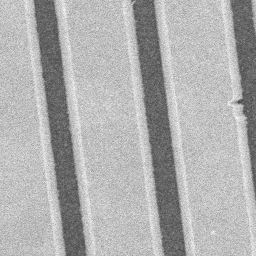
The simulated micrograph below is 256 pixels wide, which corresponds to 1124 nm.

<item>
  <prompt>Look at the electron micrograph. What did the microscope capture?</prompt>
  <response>one or a few lines or trenches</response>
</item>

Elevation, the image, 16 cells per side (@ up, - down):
@@--@@@@--@@@@--
@@--@@@@--@@@@--
@@--@@@@--@@@@--
@@--@@@@--@@@@--
@@--@@@@---@@@@-
@@--@@@@@--@@@@-
@@@--@@@@--@@@@-
@@@--@@@@--@@@@-
@@@--@@@@--@@@@-
@@@--@@@@--@@@@-
@@@--@@@@--@@@@-
@@@--@@@@--@@@@-
@@@--@@@@--@@@@@
@@@--@@@@@--@@@@
@@@@--@@@@--@@@@
@@@@--@@@@--@@@@